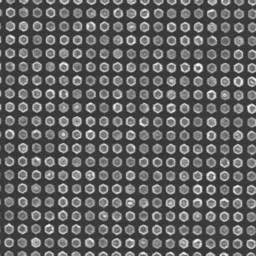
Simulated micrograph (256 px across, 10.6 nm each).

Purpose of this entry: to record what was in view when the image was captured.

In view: a regular array of raised bodies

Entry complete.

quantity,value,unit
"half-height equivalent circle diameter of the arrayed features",9.3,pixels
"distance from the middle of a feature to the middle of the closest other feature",140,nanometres